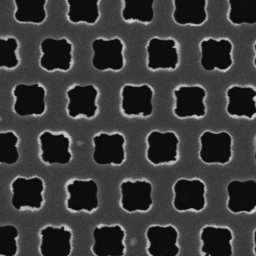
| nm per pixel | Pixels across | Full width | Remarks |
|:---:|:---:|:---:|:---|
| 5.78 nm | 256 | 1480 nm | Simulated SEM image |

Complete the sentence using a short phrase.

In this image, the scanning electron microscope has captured a regular array of holes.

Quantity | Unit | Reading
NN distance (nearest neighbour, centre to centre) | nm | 304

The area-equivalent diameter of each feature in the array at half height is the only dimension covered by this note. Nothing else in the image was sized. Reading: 183 nanometers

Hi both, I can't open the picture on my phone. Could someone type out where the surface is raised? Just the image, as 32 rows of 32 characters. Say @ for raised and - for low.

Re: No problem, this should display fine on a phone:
@@----@@@---@@@@---@@@----@@@---
@@----@@@---@@@----@@@----@@@---
@@---@@@@---@@@@@--@@@---@@@@---
@@@@@@@@@@@@@@@@@@@@@@@@@@@@@@@@
@@@@@@@@@@@@@@@@@@@@@@@@@@@@@@@@
--@@@----@@@---@@@@---@@@----@@@
--@@@----@@@---@@@@---@@@----@@@
--@@@----@@@---@@@@---@@@----@@@
@@@@@@--@@@@---@@@@@@@@@@@--@@@@
@@@@@@@@@@@@@@@@@@@@@@@@@@@@@@@@
@@@@@@@@@@@@@@@@@@@@@@@@@@@@@@@@
@@----@@@---@@@----@@@---@@@@---
@@----@@@---@@@----@@@---@@@@---
@@----@@@---@@@----@@@----@@----
@@@@@@@@@@@@@@@@@@@@@@--@@@@@@@@
@@@@@@@@@@@@@@@@@@@@@@@@@@@@@@@@
@@@@@@@@@@@@@@@@@@@@@@@@@@@@@@@@
--@@@---@@@@---@@@@---@@@----@@@
--@@@----@@@---@@@@---@@@----@@@
--@@@----@@@---@@@@---@@@----@@@
@@@@@@@@@@@@@@@@@@@@@@@@@@@@@@@@
@@@@@@@@@@@@@@@@@@@@@@@@@@@@@@@@
@@---@@@@@@@@@@@@@@@@@@@@@@@@@@@
@@---@@@@---@@@----@@@---@@@----
@@---@@@@---@@@----@@@---@@@@---
@@---@@@@---@@@----@@@---@@@@---
@@@@@@@@@@@@@@@@@@@@@@@@@@@@@@@@
@@@@@@@@@@@@@@@@@@@@@@@@@@@@@@@@
--@@@@@@@@@@---@@@@---@@@@-@@@@@
--@@@----@@@---@@@----@@@----@@@
--@@@----@@@---@@@@---@@@----@@@
--@@@----@@@---@@@@---@@@----@@@